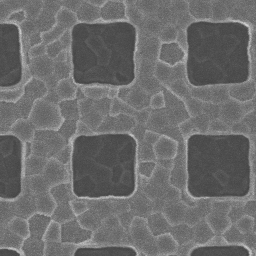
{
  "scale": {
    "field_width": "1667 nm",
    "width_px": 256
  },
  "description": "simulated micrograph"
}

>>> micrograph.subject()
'holes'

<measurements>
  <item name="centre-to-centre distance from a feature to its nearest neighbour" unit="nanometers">732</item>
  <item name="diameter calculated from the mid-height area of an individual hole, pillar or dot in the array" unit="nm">450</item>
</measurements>